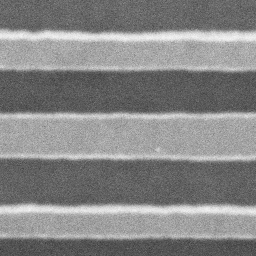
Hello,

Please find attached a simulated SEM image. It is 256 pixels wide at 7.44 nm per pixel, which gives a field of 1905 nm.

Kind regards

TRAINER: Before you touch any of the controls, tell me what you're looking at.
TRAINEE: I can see lines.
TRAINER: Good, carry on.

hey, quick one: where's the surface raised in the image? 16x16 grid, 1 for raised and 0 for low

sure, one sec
0000000000000000
0000000000000000
1111111111111111
1111111111111111
0000000000000000
0000000000000000
0000000000000000
1111111111111111
1111111111111111
1111111111111111
0000000000000000
0000000000000000
0000000000000000
1111111111111111
1111111111111111
0000000000000000